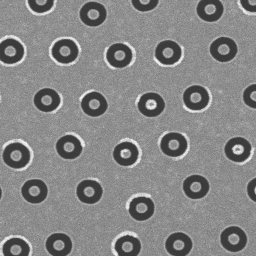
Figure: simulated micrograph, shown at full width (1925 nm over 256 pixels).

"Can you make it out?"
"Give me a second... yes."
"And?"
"a regular array of ring-shaped grooves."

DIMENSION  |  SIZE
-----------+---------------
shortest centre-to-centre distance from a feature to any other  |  358 nanometres